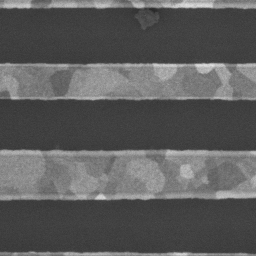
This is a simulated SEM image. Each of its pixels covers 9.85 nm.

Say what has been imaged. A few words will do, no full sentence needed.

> lines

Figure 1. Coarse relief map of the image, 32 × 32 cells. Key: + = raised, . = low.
++++++++++++++++++++++++++++++++
................................
................................
................................
................................
................................
................................
................................
++++++++++++++++++++++++++++++++
++++++++++++++++++++++++++++++++
++++++++++++++++++++++++++++++++
++++++++++++++++++++++++++++++++
................................
................................
................................
................................
................................
................................
................................
++++++++++++++++++++++++++++++++
++++++++++++++++++++++++++++++++
++++++++++++++++++++++++++++++++
++++++++++++++++++++++++++++++++
++++++++++++++++++++++++++++++++
+++++++++++++++++++++++++++++.++
................................
................................
................................
................................
................................
................................
................................